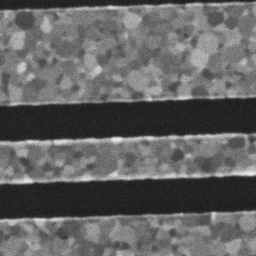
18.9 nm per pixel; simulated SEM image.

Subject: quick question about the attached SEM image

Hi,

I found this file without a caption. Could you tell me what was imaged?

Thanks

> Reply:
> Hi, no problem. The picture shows lines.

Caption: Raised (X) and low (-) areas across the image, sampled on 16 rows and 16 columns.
------XXXXXXXXXX
XXXXXXXXXXXXXXXX
XXXXXXXXXXXXXXXX
XXXXXXXXXXXXXXXX
XXXXXXXXXXXXXXXX
XXXXXXXXXXXXXXXX
X---------------
----------------
------------XXXX
XXXXXXXXXXXXXXXX
XXXXXXXXXXXXXXXX
----------------
----------------
---------XXXXXXX
XXXXXXXXXXXXXXXX
XXXXXXXXXXXXXXXX